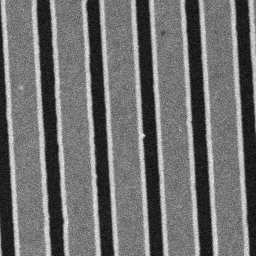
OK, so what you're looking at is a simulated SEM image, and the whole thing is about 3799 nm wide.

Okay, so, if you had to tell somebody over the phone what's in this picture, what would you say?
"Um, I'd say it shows parallel lines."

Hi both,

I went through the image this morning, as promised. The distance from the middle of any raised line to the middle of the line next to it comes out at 735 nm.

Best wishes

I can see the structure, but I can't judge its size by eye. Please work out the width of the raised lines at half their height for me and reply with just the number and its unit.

472 nm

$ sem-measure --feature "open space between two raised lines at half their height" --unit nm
265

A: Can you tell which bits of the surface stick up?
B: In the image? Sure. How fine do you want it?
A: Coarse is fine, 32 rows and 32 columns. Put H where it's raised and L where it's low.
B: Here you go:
HHHHLLLHHHHLLHHHHLLHHHHLLHHHHLLH
HHHHLLLHHHHLLHHHHLLHHHHLLHHHHLLH
HHHHLLLHHHHLLHHHHLLHHHHLLHHHHLLH
LHHHLLLHHHHLLHHHHLLHHHHLLHHHHLLL
LHHHLLLHHHHLLHHHHLLHHHHLLHHHHLLL
LHHHHLLHHHHLLHHHHLLHHHHLLHHHHLLL
LHHHHLLHHHHLLHHHHLLHHHHLLHHHHLLL
LHHHHLLHHHHLLHHHHLLHHHHLLLHHHLLL
LHHHHLLHHHHLLHHHHLLHHHHLLLHHHHLL
LHHHHLLHHHHLLHHHHLLHHHHLLLHHHHLL
LHHHHLLHHHHLLHHHHLLHHHHLLLHHHHLL
LHHHHLLHHHHLLHHHHLLLHHHHLLHHHHLL
LHHHHLLHHHHLLHHHHLLLHHHHLLHHHHLL
LHHHHLLHHHHLLLHHHLLLHHHHLLHHHHLL
LHHHHLLHHHHLLLHHHLLLHHHHLLHHHHLL
LHHHHLLHHHHLLLHHHLLLHHHHLLHHHHLL
LHHHHLLHHHHLLLHHHHLLHHHHLLHHHHLL
LHHHHLLHHHHLLLHHHHLLHHHHLLHHHHLL
LHHHHLLLHHHHLLHHHHLLHHHHLLHHHHLL
LHHHHLLLHHHHLLHHHHLLHHHHLLHHHHLL
LHHHHLLLHHHHLLHHHHLLHHHHLLHHHHLL
LLHHHLLLHHHHLLHHHHLLHHHHLLHHHHLL
LLHHHHLLHHHHLLHHHHLLHHHHLLHHHHLL
LLHHHHLLHHHHLLHHHHLLHHHHLLHHHHLL
LLHHHHLLHHHHLLHHHHLLHHHHLLLHHHLL
LLHHHHLLHHHHLLHHHHLLHHHHLLLHHHLL
LLHHHHLLHHHHLLHHHHLLLHHHLLLHHHHL
LLHHHHLLHHHHLLHHHHLLLHHHLLLHHHHL
LLHHHHLLHHHHLLHHHHLLLHHHLLLHHHHL
LLHHHHLLHHHHLLHHHHLLLHHHLLLHHHHL
LLHHHHLLHHHHLLHHHHLLLHHHHLLHHHHL
LLHHHHLLHHHHLLLHHHLLLHHHHLLHHHHL